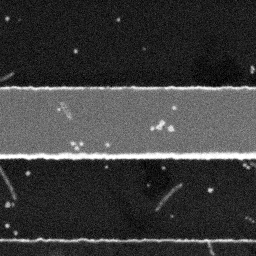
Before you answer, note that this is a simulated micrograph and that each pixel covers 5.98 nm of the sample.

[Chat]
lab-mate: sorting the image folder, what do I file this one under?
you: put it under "lines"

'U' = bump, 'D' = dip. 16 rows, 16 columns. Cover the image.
DDDDDDDDDDDDDDDD
DDDDDDDDDDDDDDDD
DDDDDDDDDDDDDDDD
DDDDDDDDDDDDDDDD
DDDDDDDDDDDDDDDD
UUUUUUUUUUUUUUUU
UUUUUUUUUUUUUUUU
UUUUUUUUUUUUUUUU
UUUUUUUUUUUUUUUU
UUUUUUUUUUUUUUUU
DDDDDDDDDDDDDDDD
DDDDDDDDDDDDDDDD
DDDDDDDDDDDDDDDD
DDDDDDDDDDDDDDDD
DDDDDDDDDDDDDDDD
UUUUUUUUUUUUUUUU